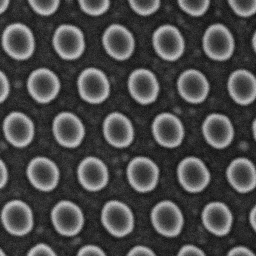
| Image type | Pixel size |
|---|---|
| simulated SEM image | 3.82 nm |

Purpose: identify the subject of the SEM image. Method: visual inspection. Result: a regular array of raised bodies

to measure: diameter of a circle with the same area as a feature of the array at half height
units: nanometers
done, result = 122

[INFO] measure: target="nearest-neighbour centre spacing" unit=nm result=190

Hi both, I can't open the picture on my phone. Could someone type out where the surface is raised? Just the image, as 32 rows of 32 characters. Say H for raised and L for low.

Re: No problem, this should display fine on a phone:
HLLLHHHLLLHHHLLLHHHHLLHHHHLLLHHH
LLLLLHHLLLLHHLLLLHHLLLLHHLLLLHHH
LLLLLLLLLLLLLLLLLLLLLLLLLLLLLLLL
LHHLLLLHHLLLLLHLLLLLHHLLLLHHLLLL
LHHHLLLHHHLLLHHHLLLHHHHLLLHHHLLL
HHHHLLLHHHLLLHHHHLLHHHHLLHHHHLLL
LHHHLLLHHHLLLHHHLLLLHHHLLLHHHLLL
LLLLLLLLLLLLLLLLLLLLLHLLLLLLLLLL
LLLLLLLLLLLLLLLLLLLLLLLLLLLLLLLL
HLLLHHHLLLHHHLLLHHHLLLLHHLLLLHHH
HLLLHHHLLLHHHHLLHHHHLLHHHHLLLHHH
HLLLHHHLLLHHHHLLHHHHLLHHHHLLLHHH
LLLLLHLLLLLHHLLLLHHLLLLHHLLLLHHH
LLLLLLLLLLLLLLLLLLLLLLLLLLLLLLLL
LHHLLLLHHLLLLLHLLLLLHHLLLLHHLLLL
HHHHLLLHHHLLLHHHLLLHHHHLLHHHHLLL
LHHHLLLHHHLLLHHHLLLHHHHLLHHHHLLL
LHHHLLLHHHLLLHHHLLLLHHHLLLHHHLLL
LLLLLLLLLLLLLLLLLLLLLLLLLLLLLLLL
LLLLLLLLLLLLLLLLLLLLLLLLLLLLLLLL
LLLLHHHLLLHHHLLLHHHLLLLHHLLLLHHL
HLLLHHHLLLHHHLLLHHHHLLHHHHLLHHHH
HLLLHHHLLLHHHLLLHHHHLLHHHHLLLHHH
LLLLLHHLLLLHHLLLLHHLLLLHHLLLLHHL
LLLLLLLLLLLLLLLLLLLLLLLLLLLLLLLL
LHHLLLLHHLLLLHHLLLLLHHLLLLHHLLLL
HHHHLLLHHHLLLHHHLLLHHHLLLHHHHLLH
HHHHLLLHHHLLLHHHHLLHHHHLLHHHHLLH
LHHHLLLHHHLLLHHHHLLHHHHLLLHHHLLL
LLLLLLLLLLLLLLLLLLLLLLLLLLLLLLLL
LLLLLLLLLLLLLLLLLLLLLLLLLLLLLLLL
LLLLHHHLLLHHHLLLHHHLLLLHHLLLLHHL